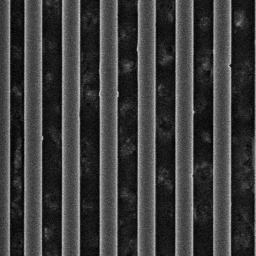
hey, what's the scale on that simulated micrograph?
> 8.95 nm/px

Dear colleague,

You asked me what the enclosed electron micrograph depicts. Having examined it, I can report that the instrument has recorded parallel lines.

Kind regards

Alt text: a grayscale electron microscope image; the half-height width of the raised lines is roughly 158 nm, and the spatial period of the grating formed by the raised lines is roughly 338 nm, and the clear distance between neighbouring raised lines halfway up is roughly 20.4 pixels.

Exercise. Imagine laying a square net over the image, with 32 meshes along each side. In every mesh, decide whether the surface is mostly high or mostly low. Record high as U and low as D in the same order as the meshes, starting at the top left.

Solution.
UDDUUDDDUUDDDUUDDUUDDDUUDDDUUDDD
UDDUUDDDUUDDDUUDDUUDDDUUDDDUUDDD
UDDUUDDDUUDDDUUDDUUDDDUUDDDUUDDD
UDDUUDDDUUDDDUUDDUUDDDUUDDDUUDDD
UDDUUDDDUUDDDUUDDUUDDDUUDDDUUDDD
UDDUUDDDUUDDDUUDDUUDDDUUDDDUUDDD
UDDUUDDDUUDDDUUDDUUDDDUUDDDUUDDD
UDDUUDDDUUDDDUUDDUUDDDUUDDDUUDDD
UDDUUDDDUUDDUUUDDUUDDDUUDDDUUDDD
UDDUUDDDUUDDUUUDDUUDDDUUDDDUUDDD
UDDUUDDDUUDDDUUDDUUDDDUUDDDUUDDD
UDDUUDDDUUDDUUUDDUUDDDUUDDDUUDDD
UDDUUDDDUUDDDUUDDUUDDDUUDDDUUDDD
UDDUUDDDUUDDDUUDDUUDDDUUDDDUUDDD
UDDUUDDDUUDDDUUDDUUDDDUUDDDUUDDD
UDDUUDDDUUDDDUUDDUUDDDUUDDDUUDDD
UDDUUDDDUUDDDUUDDUUDDDUUDDDUUDDD
UDDUUDDDUUDDDUUDDUUDDDUUDDDUUDDD
UDDUUDDDUUDDDUUDDUUDDDUUDDDUUDDD
UDDUUDDDUUDDDUUDDUUDDDUUDDDUUDDD
UDDUUDDDUUDDDUUDDUUDDDUUDDDUUDDD
UDDUUDDDUUDDDUUDDUUDDDUUDDDUUDDD
UDDUUDDDUUDDDUUDDUUDDDUUDDDUUDDD
UDDUUDDDUUDDDUUDDUUDDDUUDDDUUDDD
UDDUUDDDUUDDDUUDDUUDDDUUDDDUUDDD
UDDUUDDDUUDDDUUDDUUDDDUUDDDUUDDD
UDDUUDDDUUDDDUUDDUUDDDUUDDDUUDDD
UDDUUDDDUUDDDUUDDUUDDDUUDDDUUDDD
UDDUUDDDUUDDDUUDDUUDDDUUDDDUUDDD
UDDUUDDDUUDDDUUDDUUDDDUUDDDUUDDD
UDDUUDDDUUDDDUUDDUUDDDUUDDDUUDDD
UDDUUDDDUUDDDUUDDUUDDDUUDDDUUDDD